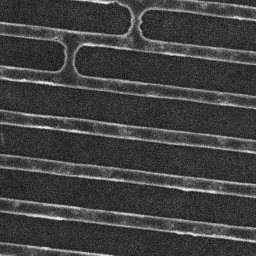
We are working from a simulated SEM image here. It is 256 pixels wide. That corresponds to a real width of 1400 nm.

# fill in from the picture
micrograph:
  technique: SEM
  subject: parallel lines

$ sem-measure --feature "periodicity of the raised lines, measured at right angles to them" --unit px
43.9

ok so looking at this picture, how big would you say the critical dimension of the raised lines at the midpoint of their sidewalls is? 0.0734 um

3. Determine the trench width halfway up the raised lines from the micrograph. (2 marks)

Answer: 170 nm